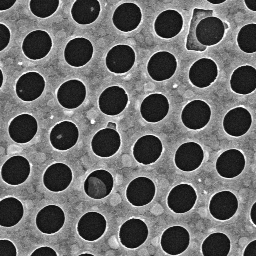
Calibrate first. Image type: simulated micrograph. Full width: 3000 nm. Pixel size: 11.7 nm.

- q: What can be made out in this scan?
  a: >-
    a regular array of holes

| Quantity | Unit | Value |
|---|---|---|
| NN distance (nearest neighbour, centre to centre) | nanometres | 492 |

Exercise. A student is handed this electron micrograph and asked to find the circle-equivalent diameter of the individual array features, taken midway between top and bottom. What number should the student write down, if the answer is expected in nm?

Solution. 343